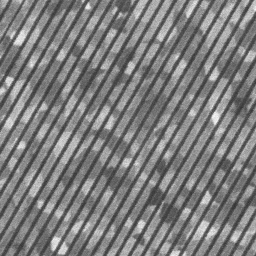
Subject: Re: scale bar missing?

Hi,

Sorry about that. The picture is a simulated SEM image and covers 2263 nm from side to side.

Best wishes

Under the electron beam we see parallel lines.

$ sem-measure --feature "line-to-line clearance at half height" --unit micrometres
0.0383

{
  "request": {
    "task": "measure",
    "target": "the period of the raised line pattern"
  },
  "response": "11 pixels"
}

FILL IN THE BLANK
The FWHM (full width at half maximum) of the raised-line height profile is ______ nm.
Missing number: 57.4